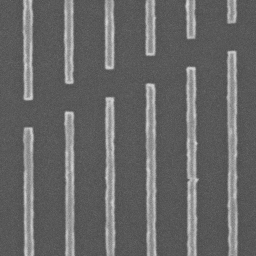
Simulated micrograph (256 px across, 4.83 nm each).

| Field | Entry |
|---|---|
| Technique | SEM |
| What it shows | parallel lines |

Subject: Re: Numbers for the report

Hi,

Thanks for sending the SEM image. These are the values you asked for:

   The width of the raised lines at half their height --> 39.2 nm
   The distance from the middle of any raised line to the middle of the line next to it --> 40.7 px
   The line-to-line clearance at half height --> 156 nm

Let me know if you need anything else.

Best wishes